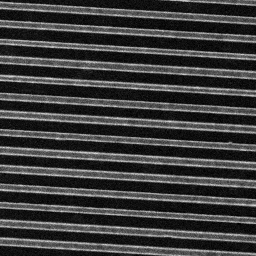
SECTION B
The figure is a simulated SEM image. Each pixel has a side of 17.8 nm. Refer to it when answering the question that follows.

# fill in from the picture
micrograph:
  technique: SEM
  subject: parallel lines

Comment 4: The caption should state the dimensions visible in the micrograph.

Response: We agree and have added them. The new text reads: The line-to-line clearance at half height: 211 nm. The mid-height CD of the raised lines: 113 nm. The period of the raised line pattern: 323 nm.